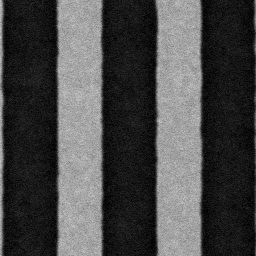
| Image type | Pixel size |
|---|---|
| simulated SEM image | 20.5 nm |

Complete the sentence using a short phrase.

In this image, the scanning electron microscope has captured wiring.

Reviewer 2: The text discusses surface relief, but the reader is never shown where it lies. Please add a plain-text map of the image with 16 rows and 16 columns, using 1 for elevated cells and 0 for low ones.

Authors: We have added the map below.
0000110000111000
0000110000111000
0000110000111000
0000110000111000
0000110000111000
0000110000111000
0000110000111000
0000110000111000
0000110000111000
0000110000111000
0000110000111000
0000110000111000
0000110000111000
0000110000111000
0000110000111000
0000110000111000